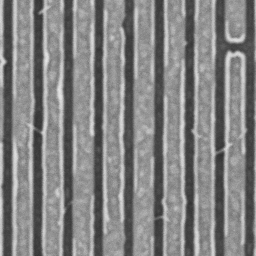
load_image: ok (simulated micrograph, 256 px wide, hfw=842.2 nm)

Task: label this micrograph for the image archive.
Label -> parallel lines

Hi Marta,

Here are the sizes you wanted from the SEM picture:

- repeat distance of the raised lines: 99.6 nanometres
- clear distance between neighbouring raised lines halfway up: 0.0304 micrometres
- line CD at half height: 0.0691 µm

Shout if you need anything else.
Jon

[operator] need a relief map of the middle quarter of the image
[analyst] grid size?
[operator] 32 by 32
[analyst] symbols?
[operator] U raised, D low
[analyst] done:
DDUUUUUDDDUUUUUDDDUUUUDDDUUUUUDD
DDUUUUUDDDUUUUUDDDUUUUDDDUUUUUDD
DDUUUUUDDDUUUUUDDDUUUUDDDUUUUUDD
DDUUUUUDDDUUUUUDDDUUUUDDDUUUUUDD
DDUUUUUDDDUUUUUDDDUUUUDDDUUUUUDD
DDUUUUUDDDUUUUUDDDUUUUDDDUUUUUDD
DDUUUUUDDDUUUUUDDDUUUUDDDUUUUUDD
DDUUUUUDDDUUUUUDDDUUUUDDDUUUUUDD
DDUUUUUDDDUUUUUDDDUUUUDDDUUUUUDD
DDUUUUUDDDUUUUUDDDUUUUDDDUUUUUDD
DDUUUUUDDDUUUUUDDDUUUUDDDUUUUUDD
DDUUUUUDDDUUUUUDDDUUUUDDDUUUUUDD
DDUUUUUDDDUUUUUDDDUUUUUDDUUUUUDD
DDUUUUUDDDUUUUUDDDUUUUUDDUUUUUDD
DDUUUUUDDDUUUUUDDDUUUUDDDUUUUUDD
DDUUUUUDDDUUUUUDDDUUUUDDDUUUUUDD
DDUUUUUDDDUUUUUDDDUUUUDDDUUUUUDD
DDUUUUUDDDUUUUUDDDUUUUDDDUUUUUDD
DDUUUUUDDDUUUUUDDDUUUUDDDUUUUUDD
DDUUUUUDDDUUUUUDDDUUUUDDDUUUUUDD
DDUUUUUDDDUUUUUDDDUUUUDDDUUUUUDD
DDUUUUUDDDUUUUUDDDUUUUDDDUUUUUDD
DDUUUUUDDDUUUUUDDDUUUUDDDUUUUUDD
DDUUUUUDDDUUUUUDDDUUUUDDDUUUUUDD
DDUUUUUDDDUUUUUDDDUUUUDDDUUUUUDD
DDUUUUUDDDUUUUUDDDUUUUDDDUUUUUDD
DDUUUUUDDDUUUUUDDDUUUUDDDUUUUUDD
DDUUUUUDDDUUUUUDDDUUUUDDDUUUUUDD
DDUUUUUDDDUUUUUDDDUUUUDDDUUUUUDD
DDUUUUUDDDUUUUUDDDUUUUDDDUUUUUDD
DDUUUUUDDDUUUUUDDDUUUUDDDUUUUUDD
DDUUUUUDDDUUUUUDDDUUUUDDDUUUUUDD